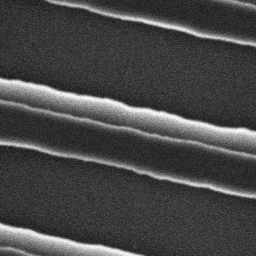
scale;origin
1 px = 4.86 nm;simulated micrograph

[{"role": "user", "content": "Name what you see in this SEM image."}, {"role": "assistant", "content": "lines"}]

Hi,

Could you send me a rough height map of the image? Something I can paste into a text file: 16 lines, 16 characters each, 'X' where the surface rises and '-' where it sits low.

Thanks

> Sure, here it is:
-----XXXXXXXXXXX
----------XXXXXX
--------------XX
----------------
----------------
XXX-------------
XXXXXXX---------
XXXXXXXXXXXX----
XXXXXXXXXXXXXXXX
---XXXXXXXXXXXXX
--------XXXXXXXX
------------XXXX
----------------
----------------
XX--------------
XXXXXXX---------